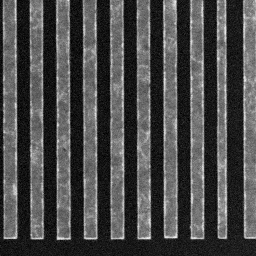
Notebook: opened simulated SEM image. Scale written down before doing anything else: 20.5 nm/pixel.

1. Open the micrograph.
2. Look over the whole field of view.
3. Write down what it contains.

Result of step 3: parallel lines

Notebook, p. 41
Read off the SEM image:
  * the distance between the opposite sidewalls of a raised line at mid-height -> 259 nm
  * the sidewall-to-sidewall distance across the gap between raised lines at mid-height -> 0.295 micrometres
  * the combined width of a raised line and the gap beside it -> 26.5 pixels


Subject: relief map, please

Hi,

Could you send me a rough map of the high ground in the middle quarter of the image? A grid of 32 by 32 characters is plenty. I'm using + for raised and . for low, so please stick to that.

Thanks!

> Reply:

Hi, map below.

+....+++....+++...+++....+++....
+....+++....+++...+++....+++....
+....+++....+++...+++....+++....
+....+++....+++...+++....+++....
+....+++....+++...+++....+++....
+....+++....+++...+++....+++....
+....+++....+++...+++....+++....
+....+++....+++...+++....+++....
+....+++....+++...+++....+++....
+....+++....+++...+++....+++....
+....+++....+++...+++....+++....
+....+++....+++...+++....+++....
+....+++....+++...+++....+++....
+....+++....+++...+++....+++....
+....+++....+++...+++....+++....
+....+++....+++...+++....+++....
+....+++....+++...+++....+++....
+....+++....+++...+++....+++....
+....+++....+++....++....+++....
+....+++....+++....++....+++....
+....+++....+++....++....+++....
+....+++....+++....++....+++....
+....+++....+++....++....+++....
+....+++....+++....++....+++....
+....+++....+++....++....+++....
+....+++....+++....++....+++....
+....+++....+++....++....+++....
+....+++....+++....++....+++....
+....+++....+++....++....+++....
+....+++....+++....++....+++....
+....+++....+++....++....+++....
+....+++....+++....++....+++....